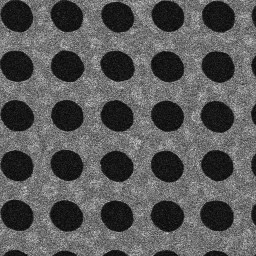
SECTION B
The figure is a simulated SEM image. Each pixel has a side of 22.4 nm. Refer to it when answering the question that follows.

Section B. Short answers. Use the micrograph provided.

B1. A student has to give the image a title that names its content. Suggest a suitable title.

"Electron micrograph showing a regular array of holes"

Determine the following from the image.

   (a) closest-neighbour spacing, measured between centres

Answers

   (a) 1110 nanometres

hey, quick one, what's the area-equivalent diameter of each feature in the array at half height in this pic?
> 722 nanometers